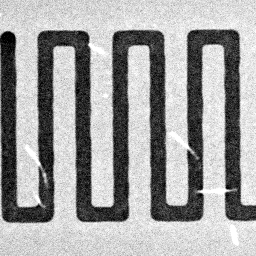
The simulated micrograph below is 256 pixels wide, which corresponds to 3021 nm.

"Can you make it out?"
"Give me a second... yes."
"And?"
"groups of lines, slits or small figures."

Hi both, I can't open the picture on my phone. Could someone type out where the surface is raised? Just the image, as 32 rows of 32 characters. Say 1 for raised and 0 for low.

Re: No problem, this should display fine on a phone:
11111111111111111111111111111111
11111111111111111111111111111111
11111111111111111111111111111111
11111111111111111111111111111111
00111000000111000000111000000011
00111000000111000000011000000011
00111001100111001110011001110011
00111001100111001110011001110011
00111001100111001110011001110011
00111001100111001110011001110011
00111001100111001110011001110011
00111001100111001110011001110011
00111001100111001110011001110011
00111001100111001110011001110011
00111001100111001110011001110011
00111001100111001110011001110011
00111001100111001110011001110011
00111001100111001110011001110011
00111001100111001110011001110011
00111001100111001110011001110011
00111001100111001110011001110011
00111001100111001110011001110011
00111001100111001110011001110011
00111001100011001110011001110011
00111001100011001110011001110011
00111001100011001110011000110001
00000001100000001110000001110000
10000011110000001110000001111000
11111111111111111111111111111111
11111111111111111111111111111111
11111111111111111111111111111111
11111111111111111111111111111111